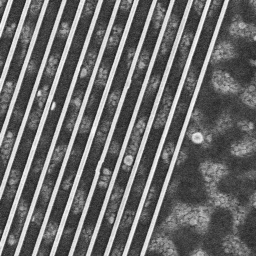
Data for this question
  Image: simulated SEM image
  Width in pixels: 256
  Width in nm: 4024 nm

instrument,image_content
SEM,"parallel lines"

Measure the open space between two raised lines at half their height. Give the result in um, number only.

0.213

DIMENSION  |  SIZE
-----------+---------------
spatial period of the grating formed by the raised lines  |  17.1 pixels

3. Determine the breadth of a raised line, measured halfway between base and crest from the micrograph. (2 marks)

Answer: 54.1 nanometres